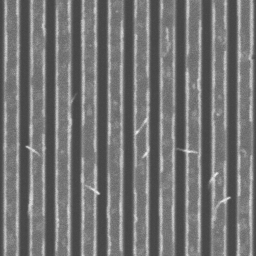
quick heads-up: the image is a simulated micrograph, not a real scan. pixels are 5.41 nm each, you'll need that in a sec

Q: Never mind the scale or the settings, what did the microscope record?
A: parallel lines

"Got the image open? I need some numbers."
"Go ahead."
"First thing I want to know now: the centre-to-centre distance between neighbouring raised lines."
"26 px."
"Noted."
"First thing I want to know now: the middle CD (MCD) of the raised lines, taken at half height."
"87.9 nm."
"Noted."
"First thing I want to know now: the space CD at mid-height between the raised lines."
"0.0487 micrometres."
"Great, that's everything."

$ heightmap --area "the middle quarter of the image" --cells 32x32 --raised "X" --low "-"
XX--XXXX---XXXX--XXXX---XXXX--XX
XX--XXXX---XXXX--XXXX---XXXX---X
XX--XXXX---XXXX--XXXX---XXXX--XX
XX--XXXX---XXXX--XXXX---XXXX--XX
XX--XXXX---XXXX--XXXX---XXXX--XX
XX--XXXX---XXXX--XXXX---XXXX--XX
XX--XXXX---XXXX--XXXX---XXXX--XX
XX--XXXX---XXXX--XXXX---XXXX--XX
XX--XXXX---XXXX--XXXX---XXXX--XX
XX--XXXX---XXXX--XXXX---XXXX--XX
XX--XXXX---XXXX--XXXX---XXXX--XX
XX--XXXX---XXXX--XXXX---XXXX--XX
XX--XXXX---XXXX--XXXX---XXXX--XX
XX--XXXX---XXXX--XXXX---XXXX--XX
XX--XXXX---XXXX--XXXX---XXXX--XX
XX--XXXX---XXXX--XXXX---XXXX--XX
XX--XXXX---XXXX--XXXX---XXXX--XX
XX--XXXX---XXXX--XXXX---XXXX--XX
XX--XXXX---XXXX--XXXX---XXXX--XX
XX--XXXX---XXXX--XXXX---XXXX--XX
XX--XXXX---XXXX--XXXX---XXXX--XX
XX--XXXX---XXXX--XXXX---XXXX--XX
XX--XXXX---XXXX--XXXX---XXXX--XX
XX--XXXX---XXXX--XXXX---XXXX--XX
XX--XXXX---XXXX--XXXX---XXXX--XX
XX--XXXX---XXXX--XXXX---XXXX--XX
XX--XXXX---XXXX--XXXX---XXXX--XX
XX--XXXX---XXXX--XXXX---XXXX--XX
XX--XXXX---XXXX--XXXX---XXXX--XX
XX--XXXX---XXXX--XXXX---XXXX--XX
XX--XXXX---XXXX--XXXX---XXXX--XX
XX--XXXX---XXXX--XXXX---XXXX--XX